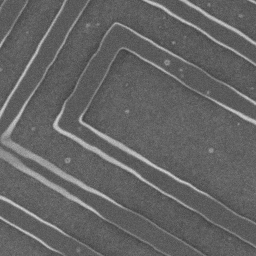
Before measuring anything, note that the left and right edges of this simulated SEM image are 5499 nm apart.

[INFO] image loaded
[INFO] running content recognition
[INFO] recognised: groups of lines, slits or small figures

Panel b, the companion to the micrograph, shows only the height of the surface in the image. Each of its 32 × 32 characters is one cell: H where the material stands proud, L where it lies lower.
HHHLLLLLHHHLLLLLLLLHHHHHLLLLLLLL
HHHLLLLHHHLLLLLLLLLLLHHHHLLLLLLL
HHLLLLLHHHLLLLLLLLLLLLLHHHHLLLLL
HHLLLLHHHLLLLLHHLLLLLLLLLHHHHLLL
HLLLLLHHLLLLLHHHHHLLLLLLLLHHHHHL
LLLLLHHHLLLLLHHHHHHLLLLLLLLLHHHH
LLLLLHHLLLLLHHHLHHHHHLLLLLLLLHHH
LLLLHHHLLLLHHHLLLLHHHHHLLLLLLLLH
LLLHHHLLLLLHHHLLLLLLHHHHHLLLLLLL
LLLHHLLLLLHHHLLLLLLLLLHHHHLLLLLL
LLHHHLLLLLHHHLLLLLLLLLLHHHHHLLLL
LLHHLLLLLHHHLLLLLLLLLLLLLHHHHHLL
LHHHLLLLHHHLLLLLLLLLLLLLLLLHHHHL
HHHLLLLLHHHLLLLLLLLLLLLLLLLLHHHH
HHLLLLLHHHLLLLLLLLLLLLLLLLLLLLHH
HHLLLLLHHHHLLLLLLLLLLLLLLLLLLLLL
HLLLLLLLHHHHLLLLLLLLLLLLLLLLLLLL
HLLLLLLLLLHHHHLLLLLLLLLLLLLLLLLL
HHLLLLLLLLLHHHHHLLLLLLLLLLLLLLLL
LHHHLLLLLLLLLHHHHLLLLLLLLLLLLLLL
LLHHHHLLLLLLLLLHHHHLLLLLLLLLLLLL
LLLLHHHLLLLLLLLLLHHHHLLLLLLLLLLL
LLLLLHHHHLLLLLLLLLHHHHLLLLLLLLLL
LLLLLLLHHHHLLLLLLLLLHHHHLLLLLLLL
LLLLLLLLLHHHHLLLLLLLLHHHHHLLLLLL
HHLLLLLLLLHHHHHLLLLLLLLHHHHHLLLL
HHHLLLLLLLLLHHHHHLLLLLLLLHHHHLLL
LHHHHLLLLLLLLHHHHHHLLLLLLLHHHHHL
LLHHHHHLLLLLLLLHHHHHLLLLLLLLHHHH
LLLLHHHHHLLLLLLLLHHHHHLLLLLLLLHH
LLLLLLHHHHLLLLLLLLLHHHHLLLLLLLLH
LLLLLLLHHHHHLLLLLLLLHHHHHLLLLLLL